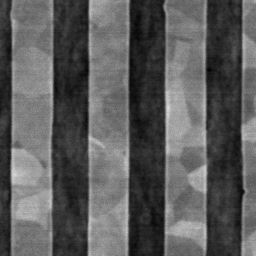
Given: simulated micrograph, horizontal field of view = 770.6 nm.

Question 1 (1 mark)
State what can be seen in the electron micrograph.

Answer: one or a few lines or trenches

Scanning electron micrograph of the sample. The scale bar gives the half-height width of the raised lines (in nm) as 117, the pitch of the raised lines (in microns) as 0.232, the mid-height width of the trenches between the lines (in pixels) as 38.6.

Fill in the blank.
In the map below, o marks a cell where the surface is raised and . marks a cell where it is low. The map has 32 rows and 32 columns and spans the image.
..ooooo....ooooo.....ooooo....oo
.oooooo....ooooo.....ooooo....oo
.oooooo....ooooo.....ooooo....oo
..oooo.....ooooo.....ooooo....oo
..oooo.....ooooo.....ooooo....oo
..oooo.....ooooo.....ooooo....oo
..ooooo....ooooo.....ooooo....oo
..ooooo....ooooo.....ooooo....oo
..ooooo....ooooo.....ooooo....oo
..ooooo....ooooo.....ooooo....oo
..oooo.....ooooo.....ooooo....oo
..oooo.....ooooo.....ooooo....oo
..oooo.....ooooo.....ooooo....oo
..oooo.....ooooo.....ooooo....oo
..oooo.....ooooo.....ooooo....oo
..oooo.....ooooo.....ooooo....oo
..oooo.....ooooo.....ooooo....oo
..oooo.....ooooo.....ooooo....oo
..oooo.....ooooo.....ooooo....oo
..oooo.....ooooo.....ooooo....oo
..oooo.....ooooo.....ooooo.....o
..oooo.....ooooo.....ooooo.....o
..oooo.....ooooo.....ooooo.....o
..oooo.....ooooo.....ooooo.....o
..oooo.....ooooo.....ooooo.....o
..oooo.....ooooo.....ooooo....oo
..oooo.....ooooo.....ooooo....oo
..oooo.....ooooo.....ooooo....oo
..oooo.....ooooo.....ooooo....oo
..oooo.....ooooo.....ooooo....oo
..oooo.....ooooo.....ooooo....oo
..oooo.....ooooo.....ooooo....oo